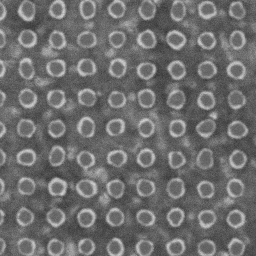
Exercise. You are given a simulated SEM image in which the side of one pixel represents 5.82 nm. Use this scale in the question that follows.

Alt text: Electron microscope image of a regular array of raised bodies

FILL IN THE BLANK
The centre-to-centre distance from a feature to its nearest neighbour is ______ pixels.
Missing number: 28.6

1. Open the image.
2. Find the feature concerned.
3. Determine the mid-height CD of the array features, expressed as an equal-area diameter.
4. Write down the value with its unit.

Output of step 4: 96 nanometres